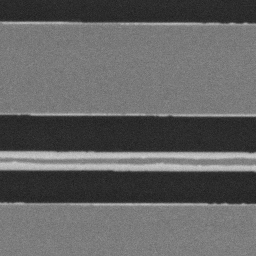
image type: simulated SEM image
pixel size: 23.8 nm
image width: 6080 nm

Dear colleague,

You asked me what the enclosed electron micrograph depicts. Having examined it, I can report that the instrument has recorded lines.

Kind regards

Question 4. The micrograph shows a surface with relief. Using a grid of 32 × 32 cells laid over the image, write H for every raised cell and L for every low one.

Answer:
LLLLLLLLLLLLLLLLLLLLLLLLLLLLLLLL
LLLLLLLLLLLLLLLLLLLLLLLLLLLLLLLL
LLLLLLLLLLLLLLLLLLLLLLLLLLLLLLLL
HHHHHHHHHHHHHHHHHHHHHHHHHHHHHHHH
HHHHHHHHHHHHHHHHHHHHHHHHHHHHHHHH
HHHHHHHHHHHHHHHHHHHHHHHHHHHHHHHH
HHHHHHHHHHHHHHHHHHHHHHHHHHHHHHHH
HHHHHHHHHHHHHHHHHHHHHHHHHHHHHHHH
HHHHHHHHHHHHHHHHHHHHHHHHHHHHHHHH
HHHHHHHHHHHHHHHHHHHHHHHHHHHHHHHH
HHHHHHHHHHHHHHHHHHHHHHHHHHHHHHHH
HHHHHHHHHHHHHHHHHHHHHHHHHHHHHHHH
HHHHHHHHHHHHHHHHHHHHHHHHHHHHHHHH
HHHHHHHHHHHHHHHHHHHHHHHHHHHHHHHH
LLLLLLLLLLLLLLLLLLLLLLLLLLLLLLLL
LLLLLLLLLLLLLLLLLLLLLLLLLLLLLLLL
LLLLLLLLLLLLLLLLLLLLLLLLLLLLLLLL
LLLLLLLLLLLLLLLLLLLLLLLLLLLLLLLL
LLLLLLLLLLLLLLLLLLLLLLLLLLLLLLLL
HHHHHHHHHHHHHHHHHHHHHHHHHHHHHHHH
HHHHHHHHHHHHHHHHHHHHHHHHHHHHHHHH
LLLLLLLLLLLLLLLLLLLLLLLLLLLLLLLL
LLLLLLLLLLLLLLLLLLLLLLLLLLLLLLLL
LLLLLLLLLLLLLLLLLLLLLLLLLLLLLLLL
LLLLLLLLLLLLLLLLLLLLLLLLLLLLLLLL
HHHHHHHHHHHHHHHHHHHHHHHHHHLLLLLL
HHHHHHHHHHHHHHHHHHHHHHHHHHHHHHHH
HHHHHHHHHHHHHHHHHHHHHHHHHHHHHHHH
HHHHHHHHHHHHHHHHHHHHHHHHHHHHHHHH
HHHHHHHHHHHHHHHHHHHHHHHHHHHHHHHH
HHHHHHHHHHHHHHHHHHHHHHHHHHHHHHHH
HHHHHHHHHHHHHHHHHHHHHHHHHHHHHHHH